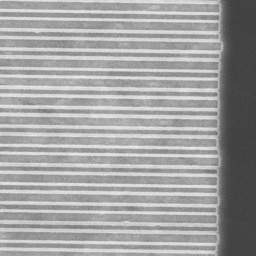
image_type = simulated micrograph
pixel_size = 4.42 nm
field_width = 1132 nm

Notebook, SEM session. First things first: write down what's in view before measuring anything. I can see parallel lines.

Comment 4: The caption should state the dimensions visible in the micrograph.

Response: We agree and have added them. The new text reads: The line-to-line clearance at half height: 7.62 pixels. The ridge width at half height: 11.6 nm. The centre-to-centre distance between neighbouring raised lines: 42.1 nanometers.